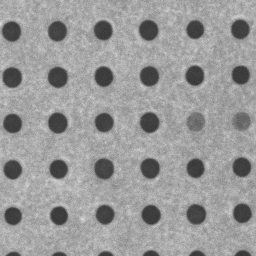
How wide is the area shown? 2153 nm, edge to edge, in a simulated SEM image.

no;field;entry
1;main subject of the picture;a regular array of holes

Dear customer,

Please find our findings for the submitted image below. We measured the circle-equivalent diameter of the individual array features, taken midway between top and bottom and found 162 nm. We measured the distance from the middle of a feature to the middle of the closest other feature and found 383 nanometers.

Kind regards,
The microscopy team